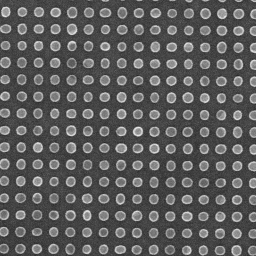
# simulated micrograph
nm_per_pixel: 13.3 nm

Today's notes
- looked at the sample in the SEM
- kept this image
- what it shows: a regular array of raised bodies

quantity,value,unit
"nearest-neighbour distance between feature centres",220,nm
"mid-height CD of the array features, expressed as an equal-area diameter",120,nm